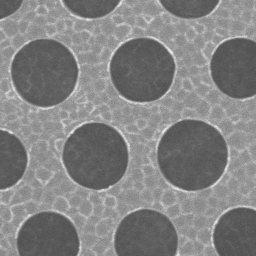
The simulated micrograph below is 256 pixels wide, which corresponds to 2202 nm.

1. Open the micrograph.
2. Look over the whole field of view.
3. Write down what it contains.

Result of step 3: holes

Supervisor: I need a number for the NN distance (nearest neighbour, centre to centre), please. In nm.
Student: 836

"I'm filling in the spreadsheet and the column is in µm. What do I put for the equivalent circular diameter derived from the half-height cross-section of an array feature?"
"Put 0.575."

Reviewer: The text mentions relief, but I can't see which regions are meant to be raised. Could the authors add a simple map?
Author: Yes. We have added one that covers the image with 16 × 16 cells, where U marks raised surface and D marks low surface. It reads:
DUUUDDDUUUDDDUUU
UUUUUUUUUUUUUUUU
UUDUUUUUDDUUUUDD
UDDDDUUDDDDUUDDD
UDDDDUUDDDDUUDDD
UDDDDUUDDDDUUUDD
UUDDUUUUUUUUUUUU
UUUUUUUUUUUUUUUU
DUUUDDDDUUDDDDUU
DDUUDDDDUUDDDDUU
DDUUDDDDUUDDDDUU
DUUUUDDUUUUDDUUU
UUUUUUUUUUUUUUUU
UUDDUUUUDDUUUUDD
UDDDDUUDDDDUUDDD
UDDDDUUDDDDUUDDD